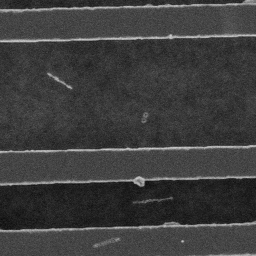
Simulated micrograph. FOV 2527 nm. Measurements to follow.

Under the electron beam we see lines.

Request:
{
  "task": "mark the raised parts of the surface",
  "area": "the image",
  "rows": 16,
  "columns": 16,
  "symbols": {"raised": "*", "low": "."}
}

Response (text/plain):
.....***********
****************
*****...........
................
................
................
................
................
................
****************
****************
***.............
................
................
****************
****************